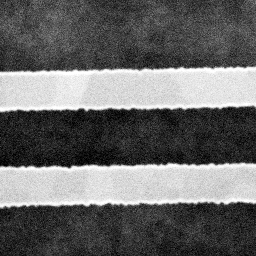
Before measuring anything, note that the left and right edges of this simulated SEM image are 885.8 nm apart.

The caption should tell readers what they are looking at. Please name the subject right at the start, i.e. lines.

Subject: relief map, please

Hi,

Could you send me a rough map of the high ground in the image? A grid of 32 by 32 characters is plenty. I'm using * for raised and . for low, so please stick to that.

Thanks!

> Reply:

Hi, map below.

................................
................................
................................
................................
................................
................................
................................
................................
................................
********************************
********************************
********************************
********************************
*************.*****.**.*........
................................
................................
................................
................................
................................
................................
................................
********************************
********************************
********************************
********************************
***********.*...................
................................
................................
................................
................................
................................
................................